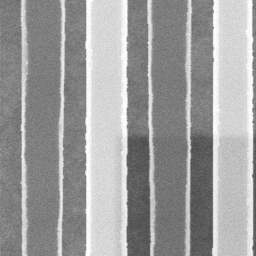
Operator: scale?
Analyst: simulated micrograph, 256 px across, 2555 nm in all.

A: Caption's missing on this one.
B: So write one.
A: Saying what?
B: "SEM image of lines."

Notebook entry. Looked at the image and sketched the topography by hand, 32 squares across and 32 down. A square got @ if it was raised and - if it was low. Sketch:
---@@@@@---@@@@@---@@@@@---@@@@-
---@@@@@---@@@@@---@@@@@---@@@@-
---@@@@@---@@@@@---@@@@@---@@@@-
---@@@@@---@@@@@---@@@@@---@@@@-
---@@@@@---@@@@@---@@@@@---@@@@-
---@@@@@---@@@@----@@@@@---@@@@-
---@@@@@---@@@@@---@@@@@---@@@@-
---@@@@@---@@@@----@@@@@---@@@@-
---@@@@@---@@@@----@@@@@---@@@@-
---@@@@@---@@@@----@@@@@---@@@@-
---@@@@@---@@@@@---@@@@@---@@@@-
---@@@@@---@@@@@---@@@@@---@@@@-
---@@@@@---@@@@@---@@@@@---@@@@-
---@@@@@---@@@@@---@@@@@---@@@@-
---@@@@@---@@@@----@@@@@---@@@@-
---@@@@@---@@@@@---@@@@@---@@@@-
---@@@@@---@@@@@---@@@@@---@@@@-
---@@@@@---@@@@@---@@@@@---@@@@-
---@@@@@---@@@@@---@@@@@---@@@@-
---@@@@@---@@@@----@@@@@---@@@@-
---@@@@@---@@@@----@@@@@---@@@@-
---@@@@@---@@@@@---@@@@@---@@@@-
---@@@@@---@@@@----@@@@@---@@@@-
---@@@@@---@@@@----@@@@@---@@@@-
---@@@@@---@@@@@---@@@@----@@@@-
---@@@@@---@@@@----@@@@----@@@@-
---@@@@@---@@@@@---@@@@----@@@@-
---@@@@@---@@@@@---@@@@----@@@@-
---@@@@@---@@@@----@@@@----@@@@-
---@@@@@---@@@@----@@@@----@@@@-
---@@@@@---@@@@----@@@@----@@@@-
---@@@@@---@@@@----@@@@----@@@@-